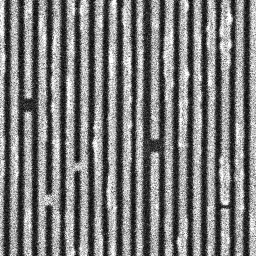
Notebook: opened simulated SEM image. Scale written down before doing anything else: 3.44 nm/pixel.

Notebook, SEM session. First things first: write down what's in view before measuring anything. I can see parallel lines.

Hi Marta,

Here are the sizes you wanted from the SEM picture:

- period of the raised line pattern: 14.1 pixels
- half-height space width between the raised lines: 0.0215 micrometres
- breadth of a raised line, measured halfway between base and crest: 27.5 nanometers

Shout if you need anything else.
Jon